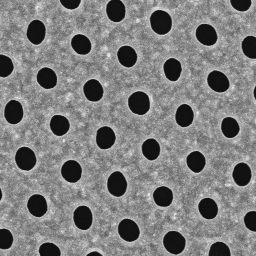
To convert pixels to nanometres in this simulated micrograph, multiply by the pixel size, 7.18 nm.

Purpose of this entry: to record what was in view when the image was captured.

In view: a regular array of holes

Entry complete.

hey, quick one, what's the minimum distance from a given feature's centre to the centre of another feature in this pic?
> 339 nm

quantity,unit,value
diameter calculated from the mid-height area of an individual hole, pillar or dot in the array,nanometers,154